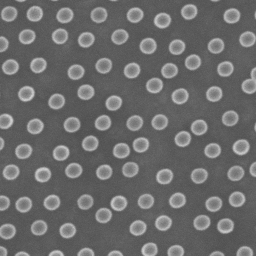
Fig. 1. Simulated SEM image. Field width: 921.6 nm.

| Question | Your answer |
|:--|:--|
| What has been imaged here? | a regular array of raised bodies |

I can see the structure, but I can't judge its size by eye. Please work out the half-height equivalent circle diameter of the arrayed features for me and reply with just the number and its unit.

53.2 nm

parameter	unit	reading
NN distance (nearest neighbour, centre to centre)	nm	93.2